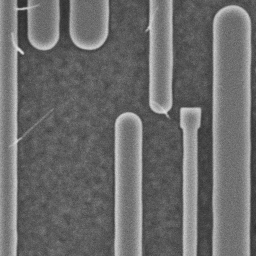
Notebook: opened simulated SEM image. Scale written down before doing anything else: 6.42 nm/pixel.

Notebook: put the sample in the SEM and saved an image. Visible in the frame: groups of lines, slits or small figures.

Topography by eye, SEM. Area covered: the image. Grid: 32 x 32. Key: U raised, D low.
UUDUUUUDDUUUUUDDDDDUUDDDDDDDDDDD
UUDUUUUDDUUUUUDDDDDUUDDDDDDUUUUD
UUDUUUUDDUUUUUDDDDDUUDDDDDDUUUUD
UUDDUUUDDUUUUDDDDDDUUDDDDDDUUUUD
UUDDUUUDDUUUUDDDDDDUUDDDDDDUUUUD
UUDDUUUDDUUUUDDDDDDUUDDDDDDUUUUD
UUDDDDDDDDDDDDDDDDDUUDDDDDDUUUUD
UUDDDDDDDDDDDDDDDDDUUDDDDDDUUUUD
UUDDDDDDDDDDDDDDDDDUUDDDDDDUUUUD
UUDDDDDDDDDDDDDDDDDUUDDDDDDUUUUD
UUDDDDDDDDDDDDDDDDDUUDDDDDDUUUUD
UUDDDDDDDDDDDDDDDDDUUDDDDDDUUUUD
UUDDDDDDDDDDDDDDDDDUUDDDDDDUUUUD
UUDDDDDDDDDDDDDDDDDUUDDDDDDUUUUD
UUDDDDDDDDDDDDDUUDDDDDDUUDDUUUUD
UUDDDDDDDDDDDDDUUUDDDDDUUDDUUUUD
UUDDDDDDDDDDDDDUUUDDDDDUUDDUUUUD
UUDDDDDDDDDDDDDUUUDDDDDUUDDUUUUD
UUDDDDDDDDDDDDUUUUDDDDDUUDDUUUUD
UUDDDDDDDDDDDDUUUUDDDDDUUDDUUUUD
UUDDDDDDDDDDDDUUUUDDDDDUUDDUUUUD
UUDDDDDDDDDDDDUUUUDDDDDUUDDUUUUD
UUDDDDDDDDDDDDDUUUDDDDDUUDDUUUUD
UUDDDDDDDDDDDDDUUUDDDDDUUDDUUUUD
UUDDDDDDDDDDDDUUUUDDDDDUUDDUUUUD
UUDDDDDDDDDDDDUUUUDDDDDUUDDUUUUD
UUDDDDDDDDDDDDUUUUDDDDDUUDDUUUUD
UUDDDDDDDDDDDDUUUUDDDDDUUDDUUUUD
UUDDDDDDDDDDDDUUUUDDDDDUUDDUUUUD
UUDDDDDDDDDDDDUUUUDDDDDUUDDUUUUD
UUDDDDDDDDDDDDUUUUDDDDDUUDDUUUUD
UUDDDDDDDDDDDDUUUUDDDDDUDDDUUUUD